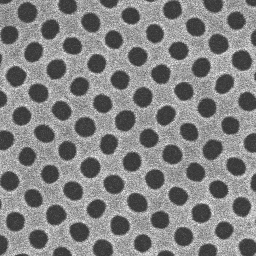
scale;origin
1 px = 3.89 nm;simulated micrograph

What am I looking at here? a regular array of holes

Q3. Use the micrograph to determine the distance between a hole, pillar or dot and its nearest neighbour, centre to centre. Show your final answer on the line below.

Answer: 111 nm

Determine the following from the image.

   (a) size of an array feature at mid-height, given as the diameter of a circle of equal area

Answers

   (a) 74.8 nanometers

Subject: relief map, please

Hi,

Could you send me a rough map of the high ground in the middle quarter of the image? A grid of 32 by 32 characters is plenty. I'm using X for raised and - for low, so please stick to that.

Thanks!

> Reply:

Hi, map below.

XXXXXX----XXXXXXXX-XXXX---XXXXXX
XXXXXX----XXXXXXXXXXXX----XXXXXX
XXXXXXXXXXXX----XXXXXX-----XXXXX
XXX--XXXXXXX----XXXXXX----XXXXXX
XX----XXXXXX----XXXXXXX---XXXXXX
XX----XXXXXX----XXXXXXXXXXXX----
XX----XXXXXXXX-XXX---XXXXXX-----
XX---XXXXXXXXXXXX-----XXXXXX----
XXXXXXXX---XXXXXX-----XXXXXX----
XXXXXXX-----XXXXXX----XXXXXXXXXX
-XXXXXX-----XXXXXXX--XXXX--XXXXX
--XXXXXX---XXXXXXXXXXXXX----XXXX
--XXXXXXXXXXX-----XXXXX-----XXXX
-XXX--XXXXXXX-----XXXXX----XXXXX
XXX-----XXXXX-----XXXXXX---XXXXX
XXX-----XXXXX----XXXXXXXXXXXX---
XXX-----XXXXXX--XXXX--XXXXXXX---
XXX----XXXXXXXXXXXX----XXXXXX---
XXXXXXXXX----XXXXXX-----XXXXXX--
--XXXXXXX-----XXXXX-----XXXXXXXX
---XXXXXX----XXXXXXX---XXX--XXXX
---XXXXXX----XXXXXXXXXXXX----XXX
---XXXXXXX--XXXX---XXXXXX-----XX
--XXXX-XXXXXXXX----XXXXXX-----XX
XXXX-----XXXXXX----XXXXXXX---XXX
XXXX-----XXXXXX----XXXXXXXXXXXX-
XXXX-----XXXXXX---XXXX--XXXXXXX-
XXXXX----XXXXXXXXXXXX----XXXXXX-
XXXXXX-XXX----XXXXXX-----XXXXXX-
X--XXXXXXX-----XXXXX-----XXXXXXX
----XXXXXX-----XXXXXX----XXXXXXX
-----XXXXX-----XXXXXXXXXXXX---XX